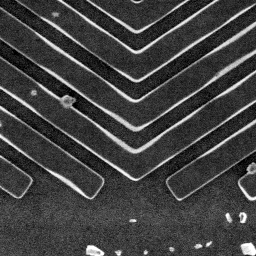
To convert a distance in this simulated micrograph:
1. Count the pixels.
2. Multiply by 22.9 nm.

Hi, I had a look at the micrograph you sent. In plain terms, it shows groups of lines, slits or small figures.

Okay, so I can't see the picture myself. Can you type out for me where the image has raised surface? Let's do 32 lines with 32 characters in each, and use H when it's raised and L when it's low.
LLLHHHHHLLLLHHHHHHHHHHHLLLHHHHHH
HLLLHHHHHHLLLHHHHHHHHLLLLHHHHHLL
HHLLLLHHHHHLLLLHHHHHLLLHHHHHHLLL
HHHHLLLHHHHHLLLLHHLLLLHHHHHLLLLH
HHHHHLLLLHHHHHLLLLLLHHHHHHLLLLHH
LHHHHHLLLLHHHHHLLLLHHHHHLLLLHHHH
LLHHHHHHLLLHHHHHHHHHHHHLLLLHHHHH
HLLLHHHHHLLLLHHHHHHHHLLLLHHHHHLL
HHLLLHHHHHHLLLHHHHHHLLLHHHHHHLLL
HHHLLLLHHHHHLLLLHHLLLLHHHHHLLLLH
HHHHHLLLHHHHHHLLLLLLHHHHHHLLLLHH
LHHHHHLLLLHHHHHLLLLHHHHHHLLLHHHH
LLHHHHHHHLLHHHHHLHHHHHHLLLLHHHHH
LLLLHHHHHLLLHHHHHHHHHHLLLHHHHHHL
HHLLLHHHHHHLLLHHHHHHLLLLHHHHHLLL
HHHLLLLHHHHHLLLLHHLLLLHHHHHHLLLH
HHHHHLLLHHHHHLLLLLLLLHHHHHLLLLHH
LHHHHHLLLLHHHHLLLLLHHHHHHLLLHHHH
LLHHHHHHLLLHHHHHLLHHHHHLLLLHHHHH
LLLHHHHHHLLLHHHHHHHHHHLLLHHHHHHL
HHLLLHHHHHLLLLHHHHHHLLLLHHHHHLLH
HHHLLLHHHHHHLLLHHHHLLLHHHHHHLLLH
HHHHLLLLHHHHHLLLLLLLLHHHHHLLLLHH
HHHHLLLLLLHHHLLLLLLLLHHHHLLLLLHH
LLHLLLLLLLLHLLLLLLLLLLHLLLLLLLLH
LLLLLLLLLLLLLLLLLLLLLLLLLLLLLLLL
LLLLLLLLLLLLLLLLLLLLLLLLLLLLLLLL
LLLLLLLLLLLLLLLLLLLLLLLLLLLLLLLL
LLLLLLLLLLLLLLLLLLLLLLLLLLLLLLLL
LLLLLLLLLLLLLLLLLLLLLLLLLLLLLLLL
LLLLLLLLLLLLLLLLLLLLLLLLLLLLLLLL
LLLLLLLLLLLHHLLLLLLLLLLLLLLLLLLH